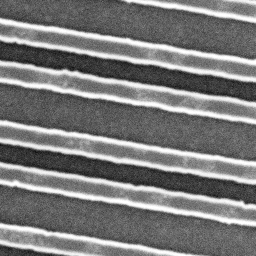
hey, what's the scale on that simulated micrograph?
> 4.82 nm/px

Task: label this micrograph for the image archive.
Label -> parallel lines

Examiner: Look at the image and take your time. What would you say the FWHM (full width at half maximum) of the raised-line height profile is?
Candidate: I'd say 90.4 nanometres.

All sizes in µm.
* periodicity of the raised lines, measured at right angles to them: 0.233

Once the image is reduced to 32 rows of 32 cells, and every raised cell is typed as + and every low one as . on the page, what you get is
...................+++++++++++++
.........................+++++++
...............................+
++++++..........................
++++++++++++....................
....++++++++++++++..............
..........++++++++++++++........
................+++++++++++++++.
+++++.................++++++++++
+++++++++++.................++++
...+++++++++++++................
.........++++++++++++++.........
...............+++++++++++++++..
.....................+++++++++++
...........................+++++
++..............................
+++++++.........................
++++++++++++++..................
.....++++++++++++++.............
...........++++++++++++++.......
.................+++++++++++++++
++++++..................++++++++
++++++++++++..................++
....++++++++++++++..............
..........++++++++++++++........
................++++++++++++++..
......................++++++++++
............................++++
++..............................
+++++++++.......................
.++++++++++++++.................
.......++++++++++++++...........